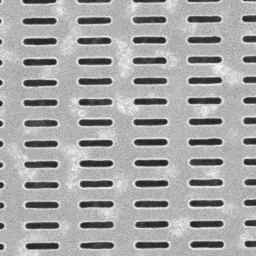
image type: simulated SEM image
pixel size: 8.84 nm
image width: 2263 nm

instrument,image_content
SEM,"a regular array of holes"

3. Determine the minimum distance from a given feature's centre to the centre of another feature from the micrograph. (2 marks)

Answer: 178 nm